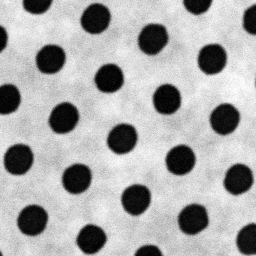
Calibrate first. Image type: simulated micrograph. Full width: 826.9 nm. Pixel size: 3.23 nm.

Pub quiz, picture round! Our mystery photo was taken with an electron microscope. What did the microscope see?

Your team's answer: a regular array of holes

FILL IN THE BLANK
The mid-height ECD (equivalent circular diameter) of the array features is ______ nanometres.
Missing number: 97.4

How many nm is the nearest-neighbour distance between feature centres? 195